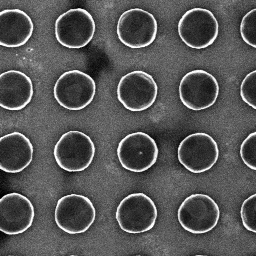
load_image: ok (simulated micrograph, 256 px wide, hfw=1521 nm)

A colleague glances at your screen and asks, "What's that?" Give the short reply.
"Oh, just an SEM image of a regular array of raised bodies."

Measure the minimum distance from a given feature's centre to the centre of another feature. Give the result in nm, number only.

364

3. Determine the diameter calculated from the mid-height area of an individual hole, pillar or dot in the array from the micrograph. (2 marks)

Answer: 38.8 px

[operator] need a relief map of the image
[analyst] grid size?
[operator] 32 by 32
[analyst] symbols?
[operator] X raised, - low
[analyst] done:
--------------------------------
-XX-----XXX-----XX------XX-----X
XXXX---XXXX----XXXX----XXXX---XX
XXXX---XXXXX---XXXXX--XXXXX---XX
XXXX---XXXX----XXXX----XXXX---XX
XXX-----XXX-----XXX----XXX-----X
--------------------------------
--------------------------------
--------------------------------
XXX-----XXX-----XXX----XXX-----X
XXXX---XXXXX---XXXX----XXXX---XX
XXXX---XXXXX---XXXXX---XXXX---XX
XXXX---XXXX----XXXX----XXXX----X
-X------XX------XX------XX------
--------------------------------
--------------------------------
---------X----------------------
XXX----XXXX----XXXX----XXXX----X
XXXX---XXXXX---XXXXX--XXXXX---XX
XXXX---XXXXX---XXXX---XXXXX---XX
XXXX---XXXX----XXXX----XXXX----X
--------------------------------
--------------------------------
--------------------------------
-XX------X------XX------XX------
XXXX---XXXX----XXXX----XXXX---XX
XXXX---XXXXX---XXXX---XXXXX---XX
XXXX---XXXXX---XXXX---XXXXX---XX
XXX-----XXX----XXXX----XXX-----X
--------------------------------
--------------------------------
--------------------------------